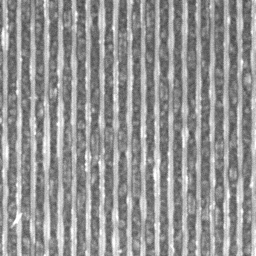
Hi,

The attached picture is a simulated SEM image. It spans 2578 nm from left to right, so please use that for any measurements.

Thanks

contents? parallel lines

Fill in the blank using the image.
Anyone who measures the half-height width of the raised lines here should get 40.3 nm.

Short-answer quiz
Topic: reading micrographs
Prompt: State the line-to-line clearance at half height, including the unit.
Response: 96.9 nm